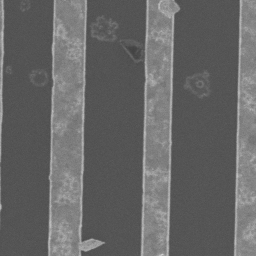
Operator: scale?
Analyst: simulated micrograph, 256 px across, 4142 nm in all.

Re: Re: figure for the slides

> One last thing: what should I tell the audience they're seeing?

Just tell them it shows one or a few lines or trenches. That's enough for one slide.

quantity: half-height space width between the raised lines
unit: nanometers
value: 1010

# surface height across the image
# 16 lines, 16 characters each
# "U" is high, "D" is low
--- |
DDDUUDDDDUUDDDDU
DDDUUDDDDUUDDDDU
DDDUUDDDDUUDDDDU
DDDUUDDDUUUDDDDU
DDDUUDDDDUUDDDDU
DDDUUDDDDUUDDDDU
DDDUUDDDDUUDDDDU
DDDUUDDDDUUDDDDU
DDDUUDDDDUUDDDDU
DDDUUDDDDUUDDDDU
DDDUUDDDDUUDDDDU
DDDUUDDDDUUDDDDU
DDDUUDDDDUUDDDDU
DDDUUDDDDUUDDDDU
DDDUUDDDDUUDDDDU
DDDUUUDDDUDDDDDU